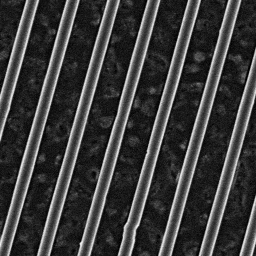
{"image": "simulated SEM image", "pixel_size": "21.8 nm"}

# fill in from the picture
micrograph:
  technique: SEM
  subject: parallel lines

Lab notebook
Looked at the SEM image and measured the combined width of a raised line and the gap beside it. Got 0.849 micrometres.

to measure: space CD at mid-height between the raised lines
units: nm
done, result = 590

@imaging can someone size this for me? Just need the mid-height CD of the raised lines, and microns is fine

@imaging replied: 0.246